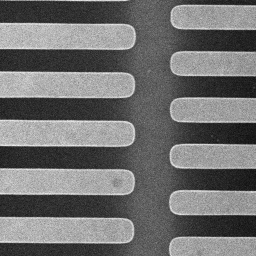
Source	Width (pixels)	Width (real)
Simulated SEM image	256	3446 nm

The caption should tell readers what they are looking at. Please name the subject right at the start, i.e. groups of lines, slits or small figures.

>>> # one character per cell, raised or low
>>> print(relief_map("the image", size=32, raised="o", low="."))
................................
.....................ooooooooooo
.....................ooooooooooo
ooooooooooooooooo.....oooooooooo
ooooooooooooooooo...............
ooooooooooooooooo...............
.......................oo.......
.....................ooooooooooo
.....................ooooooooooo
oooooooooooooooo................
ooooooooooooooooo...............
ooooooooooooooooo...............
......................oooooooooo
.....................ooooooooooo
.....................ooooooooooo
oooooooooooooooo................
ooooooooooooooooo...............
ooooooooooooooooo...............
......................oooooooooo
.....................ooooooooooo
......................oooooooooo
oooooooooooooooo................
ooooooooooooooooo...............
ooooooooooooooooo...............
.....................ooooooooooo
.....................ooooooooooo
......................oooooooooo
oooooooooooooooo................
ooooooooooooooooo...............
ooooooooooooooooo...............
.....................ooooooooooo
.....................ooooooooooo